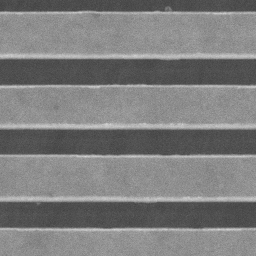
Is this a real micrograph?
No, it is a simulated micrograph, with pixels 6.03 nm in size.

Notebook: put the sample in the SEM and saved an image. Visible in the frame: lines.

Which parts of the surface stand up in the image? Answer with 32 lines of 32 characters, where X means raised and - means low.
--------------------------------
--------------------------------
XXXXXXXXXXXXXXXXXXXXXXXXXXXXXXXX
XXXXXXXXXXXXXXXXXXXXXXXXXXXXXXXX
XXXXXXXXXXXXXXXXXXXXXXXXXXXXXXXX
XXXXXXXXXXXXXXXXXXXXXXXXXXXXXXXX
XXXXXXXXXXXXXXXXXXXXXXXXXXXXXXXX
--------------------------------
--------------------------------
--------------------------------
--------------------------------
XXXXXXXXXXXXXXXXXXXXXXXXXXXXXXXX
XXXXXXXXXXXXXXXXXXXXXXXXXXXXXXXX
XXXXXXXXXXXXXXXXXXXXXXXXXXXXXXXX
XXXXXXXXXXXXXXXXXXXXXXXXXXXXXXXX
XXXXXXXXXXXXXXXXXXXXXXXXXXXXXXXX
--------------------------------
--------------------------------
--------------------------------
XXXXXXXXXXXXXXXXXXXXXXXXXXXXXXXX
XXXXXXXXXXXXXXXXXXXXXXXXXXXXXXXX
XXXXXXXXXXXXXXXXXXXXXXXXXXXXXXXX
XXXXXXXXXXXXXXXXXXXXXXXXXXXXXXXX
XXXXXXXXXXXXXXXXXXXXXXXXXXXXXXXX
XXXXXXXXXXXXXXXXXXXXXXXXXXXXXXXX
--------------------------------
--------------------------------
--------------------------------
--------------------------------
XXXXXXXXXXXXXXXXXXXXXXXXXXXXXXXX
XXXXXXXXXXXXXXXXXXXXXXXXXXXXXXXX
XXXXXXXXXXXXXXXXXXXXXXXXXXXXXXXX